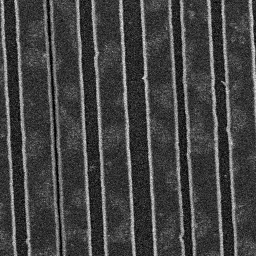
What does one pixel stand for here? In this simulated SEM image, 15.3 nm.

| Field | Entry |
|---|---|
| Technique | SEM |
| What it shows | parallel lines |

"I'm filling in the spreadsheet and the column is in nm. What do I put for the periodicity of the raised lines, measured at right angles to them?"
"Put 626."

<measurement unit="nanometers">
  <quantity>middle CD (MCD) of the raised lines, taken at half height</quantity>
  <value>434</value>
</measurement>